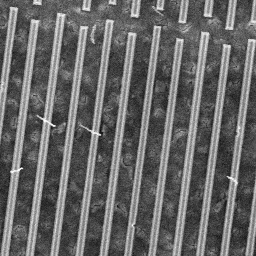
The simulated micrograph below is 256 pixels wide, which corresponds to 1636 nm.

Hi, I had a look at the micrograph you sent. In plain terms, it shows parallel lines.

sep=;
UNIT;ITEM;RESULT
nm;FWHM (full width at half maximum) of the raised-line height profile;41.1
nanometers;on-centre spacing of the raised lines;154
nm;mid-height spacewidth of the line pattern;112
